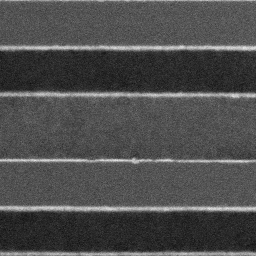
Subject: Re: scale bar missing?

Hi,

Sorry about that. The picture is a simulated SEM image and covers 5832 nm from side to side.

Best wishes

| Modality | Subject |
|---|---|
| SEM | lines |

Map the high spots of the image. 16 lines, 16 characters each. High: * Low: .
****************
****************
****************
................
................
................
****************
****************
****************
****************
****************
****************
****************
................
................
................